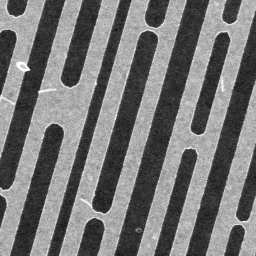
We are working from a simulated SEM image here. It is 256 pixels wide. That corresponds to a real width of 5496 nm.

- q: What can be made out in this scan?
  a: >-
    parallel lines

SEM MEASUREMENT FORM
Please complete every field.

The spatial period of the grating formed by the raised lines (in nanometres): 734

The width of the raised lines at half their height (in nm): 341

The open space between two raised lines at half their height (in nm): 426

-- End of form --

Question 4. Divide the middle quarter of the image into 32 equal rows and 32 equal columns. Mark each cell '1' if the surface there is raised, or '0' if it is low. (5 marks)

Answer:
00000111100011111000001111000000
00000111100011110000001111000000
00001111100011110000011110000001
00001111000011110000011110000001
00001111000111100000011110000001
00011111000111100000111100000011
11111110000111100000111100000011
11111110001111100000111100000011
11111110001111000000111100000011
11111110001111000001111000000111
11111100001111000001111000000111
11111100011110000001111000000111
11111100011110000011110000001111
11111000011110000011110000001111
11111000111110000011110000001111
11111000111100000011110000001111
11111000111100000111100000011111
11110000111100000111100000011111
11110001111000000111100000011111
11110001111000000111000000111111
11100001111000001111000000111111
11100011111000001111000000111100
11100011110000001111000000111100
11100011110000011110000001111000
11000011110000011110000001111000
11000111100000011110000001111000
11000111100000011100000011110000
10000111100000111100000011110000
10001111100000111100000011110000
10001111000000111100000011110000
10001111000001111000000111100001
00001111000001111000000111100001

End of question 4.